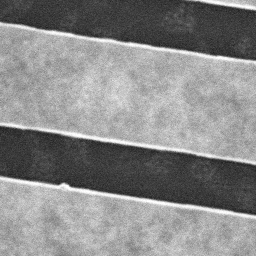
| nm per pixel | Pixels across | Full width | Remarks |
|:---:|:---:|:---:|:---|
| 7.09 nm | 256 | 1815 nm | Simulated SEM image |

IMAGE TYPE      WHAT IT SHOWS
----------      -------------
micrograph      one or a few lines or trenches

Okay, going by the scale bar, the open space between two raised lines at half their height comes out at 0.383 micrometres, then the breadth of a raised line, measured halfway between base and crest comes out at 98.4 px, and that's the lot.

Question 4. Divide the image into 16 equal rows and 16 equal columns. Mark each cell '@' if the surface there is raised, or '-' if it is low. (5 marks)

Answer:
----------------
----------------
@@@@@@----------
@@@@@@@@@@@@@---
@@@@@@@@@@@@@@@@
@@@@@@@@@@@@@@@@
@@@@@@@@@@@@@@@@
@@@@@@@@@@@@@@@@
-----@@@@@@@@@@@
------------@@@@
----------------
@@--------------
@@@@@@@@@-------
@@@@@@@@@@@@@@@-
@@@@@@@@@@@@@@@@
@@@@@@@@@@@@@@@@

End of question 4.